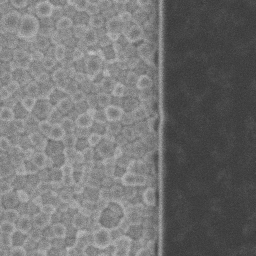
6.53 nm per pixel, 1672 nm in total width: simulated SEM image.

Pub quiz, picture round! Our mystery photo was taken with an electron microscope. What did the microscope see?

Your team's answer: one or a few lines or trenches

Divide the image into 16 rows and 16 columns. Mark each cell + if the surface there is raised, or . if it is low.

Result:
..........++++++
..........++++++
..........++++++
..........++++++
..........++++++
..........++++++
..........++++++
..........++++++
..........++++++
..........++++++
..........++++++
..........++++++
..........++++++
..........++++++
..........++++++
..........++++++